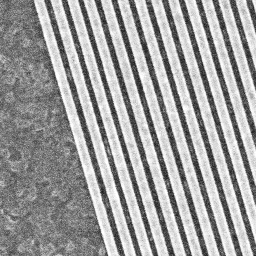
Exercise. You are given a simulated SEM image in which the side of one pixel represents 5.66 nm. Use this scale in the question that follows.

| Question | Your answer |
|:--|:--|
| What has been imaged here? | parallel lines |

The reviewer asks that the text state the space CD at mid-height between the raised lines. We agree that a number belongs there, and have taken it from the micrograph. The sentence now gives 40.1 nanometers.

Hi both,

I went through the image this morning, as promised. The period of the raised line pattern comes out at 16.1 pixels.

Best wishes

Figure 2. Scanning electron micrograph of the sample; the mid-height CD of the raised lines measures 50.3 nm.